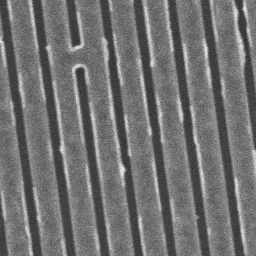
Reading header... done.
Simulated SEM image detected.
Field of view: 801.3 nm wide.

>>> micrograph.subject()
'parallel lines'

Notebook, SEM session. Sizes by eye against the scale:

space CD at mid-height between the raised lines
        0.0298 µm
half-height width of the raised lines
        76.4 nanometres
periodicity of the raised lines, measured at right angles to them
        33.4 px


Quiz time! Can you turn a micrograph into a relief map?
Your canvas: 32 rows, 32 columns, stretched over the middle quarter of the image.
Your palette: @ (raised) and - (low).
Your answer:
@@@@@@@@@@@--@@@@@@---@@@@@@--@@
@@@--@@@@@@--@@@@@@---@@@@@@--@@
@@@--@@@@@@---@@@@@@--@@@@@@---@
@@@--@@@@@@---@@@@@@--@@@@@@---@
@@@---@@@@@@--@@@@@@--@@@@@@---@
@@@---@@@@@@--@@@@@@---@@@@@---@
@@@---@@@@@@--@@@@@@---@@@@@@--@
@@@---@@@@@@---@@@@@---@@@@@@--@
@@@@--@@@@@@---@@@@@---@@@@@@--@
@@@@--@@@@@@---@@@@@@--@@@@@@--@
@@@@--@@@@@@---@@@@@@--@@@@@@--@
@@@@---@@@@@@--@@@@@@--@@@@@@---
@@@@---@@@@@@--@@@@@@---@@@@@@--
@@@@---@@@@@@--@@@@@@---@@@@@@--
@@@@---@@@@@@--@@@@@@---@@@@@@--
@@@@---@@@@@@--@@@@@@@--@@@@@@--
@@@@@--@@@@@@---@@@@@@--@@@@@@--
@@@@@---@@@@@---@@@@@@--@@@@@@--
@@@@@---@@@@@---@@@@@@--@@@@@@--
@@@@@---@@@@@@--@@@@@@--@@@@@@--
@@@@@---@@@@@@--@@@@@@---@@@@@--
@@@@@---@@@@@@--@@@@@@---@@@@@@-
@@@@@---@@@@@@--@@@@@@---@@@@@@-
@@@@@@--@@@@@@--@@@@@@---@@@@@@-
@@@@@@--@@@@@@---@@@@@@--@@@@@@-
@@@@@@--@@@@@@@--@@@@@@--@@@@@@-
@@@@@@---@@@@@@--@@@@@@--@@@@@@-
@@@@@@---@@@@@@--@@@@@@---@@@@@-
@@@@@@---@@@@@@--@@@@@@---@@@@@@
-@@@@@---@@@@@@---@@@@@---@@@@@@
-@@@@@@--@@@@@@---@@@@@---@@@@@@
-@@@@@@--@@@@@@---@@@@@@--@@@@@@